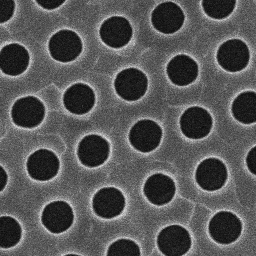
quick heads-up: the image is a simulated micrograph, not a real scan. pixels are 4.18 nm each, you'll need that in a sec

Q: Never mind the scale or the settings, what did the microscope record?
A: a regular array of holes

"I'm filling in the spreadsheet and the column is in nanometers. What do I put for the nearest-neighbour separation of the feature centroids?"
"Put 221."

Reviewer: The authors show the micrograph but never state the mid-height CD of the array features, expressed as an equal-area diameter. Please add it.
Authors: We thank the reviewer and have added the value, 139 nanometres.